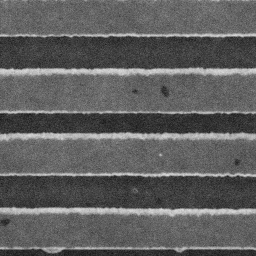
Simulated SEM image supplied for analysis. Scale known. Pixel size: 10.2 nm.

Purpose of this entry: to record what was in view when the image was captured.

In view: lines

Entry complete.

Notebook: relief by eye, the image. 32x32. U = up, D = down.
UUUUUUUUUUUUUUUUUUUUUUUUUUUUUUUU
UUUUUUUUUUUUUUUUUUUUUUUUUUUUUUUU
UUUUUUUUUUUUUUUUUUUUUUUUUUUUUUUU
UUUUUUUUUUUUUUUUUUUUUUUUUUUUUUUU
DDDDDUDDDDDDDDDDDDDDDDDDDDDDDDDD
DDDDDDDDDDDDDDDDDDDDDDDDDDDDDDDD
DDDDDDDDDDDDDDDDDDDDDDDDDDDDDDDD
DDDDDDDDDDDDDDDDDDDDDDDDDDDDDDDD
DDDDDDDDDDDDDDDDDDDDDDDDDDDDDDDD
UUUUUUUUUUUUUUUUUUUUUUUUUUUUUUUU
UUUUUUUUUUUUUUUUUUUUUUUUUUUUUUUU
UUUUUUUUUUUUUUUUUUUUUUUUUUUUUUUU
UUUUUUUUUUUUUUUUUUUUUUUUUUUUUUUU
UUUUUUUUUUUUUUUUUUUUUUUUUUUUUUUU
DDDDDDDDDDDDDDDDDDDDDDDDDDDDDDDD
DDDDDDDDDDDDDDDDDDDDDDDDDDDDDDDD
DDDDDDDDDDDDDDDDDDDDDDDDDDDDDDDD
UUUUUUUUUUUUUUUUUUUUUUUUUUUUUUUU
UUUUUUUUUUUUUUUUUUUUUUUUUUUUUUUU
UUUUUUUUUUUUUUUUUUUUUUUUUUUUUUUU
UUUUUUUUUUUUUUUUUUUUUUUUUUUUUUUU
UUUUUUUUUUUUUUUUUUUUUUUUUUUUUUUU
DDDDDDDDDDDDDDDDDDDDDDDDDDDDDDDD
DDDDDDDDDDDDDDDDDDDDDDDDDDDDDDDD
DDDDDDDDDDDDDDDDDDDDDDDDDDDDDDDD
DDDDDDDDDDDDDDDDDDDDDDDDDDDDDDDD
UUUUUUUUUUUUUUUUUUUUUUUUUUUUUUUU
UUUUUUUUUUUUUUUUUUUUUUUUUUUUUUUU
UUUUUUUUUUUUUUUUUUUUUUUUUUUUUUUU
UUUUUUUUUUUUUUUUUUUUUUUUUUUUUUUU
UUUUUUUUUUUUUUUUUUUUUUUUUUUUUUUU
DDDDDDDDDDDDDDDDDDDDDDDDDDDDDDDD